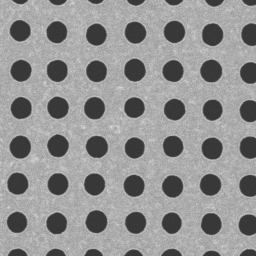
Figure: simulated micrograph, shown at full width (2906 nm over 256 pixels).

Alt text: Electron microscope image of a regular array of holes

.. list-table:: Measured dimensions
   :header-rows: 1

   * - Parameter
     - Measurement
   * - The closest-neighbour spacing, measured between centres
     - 417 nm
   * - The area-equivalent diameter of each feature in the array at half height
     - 245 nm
